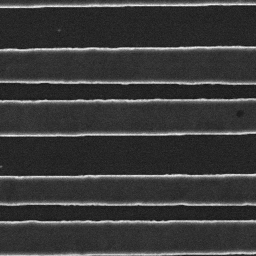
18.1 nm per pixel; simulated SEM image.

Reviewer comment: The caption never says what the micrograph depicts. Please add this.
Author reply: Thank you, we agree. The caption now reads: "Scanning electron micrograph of lines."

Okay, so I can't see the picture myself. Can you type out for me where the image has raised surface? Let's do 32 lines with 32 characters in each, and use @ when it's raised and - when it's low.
@@@@@@@@@@@@@@@@@@@@@@@@@@@@@@@@
--------------------------------
--------------------------------
--------------------------------
--------------------------------
--------------------------------
@@@@@@@@@@@@@@@@@@@@@@@@@@@@@@@@
@@@@@@@@@@@@@@@@@@@@@@@@@@@@@@@@
@@@@@@@@@@@@@@@@@@@@@@@@@@@@@@@@
@@@@@@@@@@@@@@@@@@@@@@@@@@@@@@@@
----------------------------@@@@
--------------------------------
-------------------@@@@@@@@@@@@@
@@@@@@@@@@@@@@@@@@@@@@@@@@@@@@@@
@@@@@@@@@@@@@@@@@@@@@@@@@@@@@@@@
@@@@@@@@@@@@@@@@@@@@@@@@@@@@@@@@
@@@@@@@@@@@@@@@@@@@@@@@@@@@@@@@@
--------------------------------
--------------------------------
--------------------------------
--------------------------------
--------------------------------
@@@@@@@@@@@@@@@@@@@@@@@@@@@@@@@@
@@@@@@@@@@@@@@@@@@@@@@@@@@@@@@@@
@@@@@@@@@@@@@@@@@@@@@@@@@@@@@@@@
@@@@@@@@@@@@@@@@@@@@@@@@@@@@@@@@
--------------------------------
--------------------------------
@@@@@@@@@@@@@@@@@@@@@@@@@@@@@@@@
@@@@@@@@@@@@@@@@@@@@@@@@@@@@@@@@
@@@@@@@@@@@@@@@@@@@@@@@@@@@@@@@@
@@@@@@@@@@@@@@@@@@@@@@@@@@@@@@@@